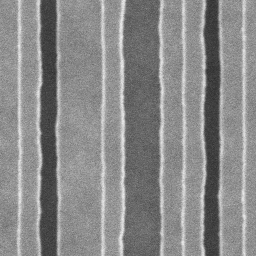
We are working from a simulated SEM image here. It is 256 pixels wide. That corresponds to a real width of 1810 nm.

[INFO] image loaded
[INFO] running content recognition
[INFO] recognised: lines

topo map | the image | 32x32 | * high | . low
*****..*********....******.*****
*****..********.....******.*****
*****..********.....*****..*****
*****..********.....*****..*****
*****..********.....*****..*****
*****..********.....*****...****
*****..********.....******.*****
*****..********.....******..****
*****..********.....******..****
*****..********.....******..****
*****..********.....******..****
*****..********.....*****...****
*****..********.....*****...****
*****..********.....*****...****
*****..********.....*****..*****
*****..********.....*****..*****
*****..********.....*****...****
*****..********.....*****...****
*****..********.....******..****
*****..********.....******..****
*****..********.....******..****
*****..********.....******..****
*****..********.....******.*****
*****..********.....*****..*****
*****..********.....*****..*****
*****..*********....*****..*****
*****..*********....*****..*****
*****..********.....*****...****
*****..********.....*****...****
*****..********.....*****..*****
*****..********.....*****...****
*****..********.....*****...****